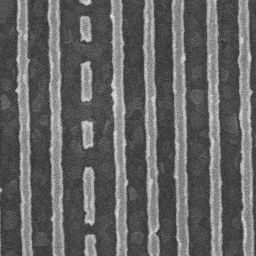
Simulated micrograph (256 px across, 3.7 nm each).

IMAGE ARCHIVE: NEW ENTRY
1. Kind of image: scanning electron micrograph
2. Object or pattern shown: parallel lines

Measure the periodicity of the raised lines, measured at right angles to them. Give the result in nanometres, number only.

117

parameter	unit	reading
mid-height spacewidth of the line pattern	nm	78.5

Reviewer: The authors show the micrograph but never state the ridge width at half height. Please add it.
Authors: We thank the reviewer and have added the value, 0.0411 microns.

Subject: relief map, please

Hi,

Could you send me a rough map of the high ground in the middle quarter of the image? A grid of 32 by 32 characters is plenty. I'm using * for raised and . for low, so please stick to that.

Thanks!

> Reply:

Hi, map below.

....**.......**.....***....***..
....***......**.....**.....***..
....***.....***.....***....***..
....***.....***.....**.....***..
....***.....***.....***....***..
....***.....***.....***....***..
.....**.....***......**....***..
.....**.....***......**....***..
.....**.....***......**.....**..
............***.....***.....**..
............***.....***.....**..
............***......**.....**..
.............**.....***.....**..
.............**.....***.....**..
.....*.......**.....***.....**..
....***......**.....***.....**..
.....**......**.....***.....**..
.....**.....***......**.....**..
.....**.....***......**.....***.
.....**.....***......**.....***.
.....**.....***......**.....***.
............***......**.....***.
.............**......**.....***.
.............**......**.....***.
.............***.....**.....***.
.............**......**.....**..
.....**......**......**.....**..
.....***.....**......***...****.
.....***.....***.....**....****.
.....**......***.....**.....***.
.....**......***.....**.....***.
.....**......**......***....***.